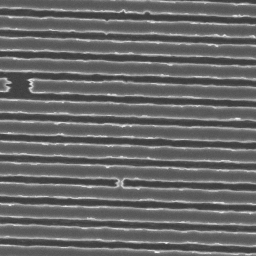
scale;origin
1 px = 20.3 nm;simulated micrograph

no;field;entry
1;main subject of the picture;parallel lines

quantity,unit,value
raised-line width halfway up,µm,0.279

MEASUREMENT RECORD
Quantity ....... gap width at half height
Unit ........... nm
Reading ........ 140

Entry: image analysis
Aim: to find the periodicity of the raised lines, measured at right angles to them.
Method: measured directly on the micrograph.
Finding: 423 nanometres